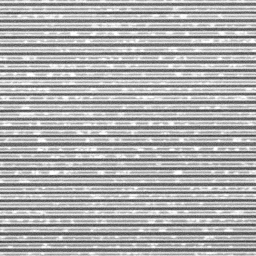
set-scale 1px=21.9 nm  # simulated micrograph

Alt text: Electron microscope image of parallel lines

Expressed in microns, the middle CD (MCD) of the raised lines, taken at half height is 0.0795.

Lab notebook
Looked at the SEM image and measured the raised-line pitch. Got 0.179 micrometres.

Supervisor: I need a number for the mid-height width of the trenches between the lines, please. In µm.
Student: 0.0987